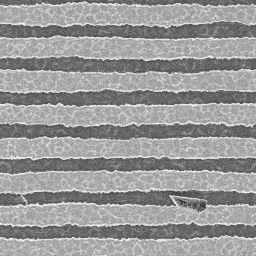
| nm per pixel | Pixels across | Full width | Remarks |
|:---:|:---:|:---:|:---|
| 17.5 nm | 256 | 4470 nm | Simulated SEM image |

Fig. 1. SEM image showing parallel lines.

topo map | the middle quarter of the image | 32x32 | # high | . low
................................
................................
##################.#######.###..
################################
################################
################################
#########....####.....#########.
................................
................................
................................
..#...#..#.#...##.###.####.#####
################################
################################
################################
###############################.
#.#..#..........................
................................
................................
##.............................#
################################
################################
################################
################################
#.#.......#....................#
................................
................................
.........................#......
################################
################################
################################
################################
##.###############.##...#..#####